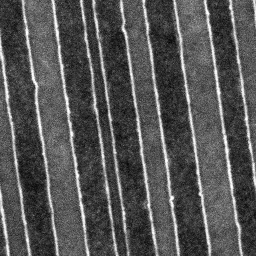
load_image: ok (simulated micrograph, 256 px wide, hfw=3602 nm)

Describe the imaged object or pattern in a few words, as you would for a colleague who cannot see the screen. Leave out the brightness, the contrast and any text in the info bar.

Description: parallel lines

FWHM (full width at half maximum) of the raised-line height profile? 409 nanometers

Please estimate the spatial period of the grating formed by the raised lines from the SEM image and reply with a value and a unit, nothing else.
715 nm